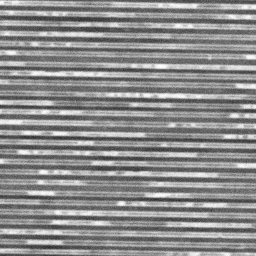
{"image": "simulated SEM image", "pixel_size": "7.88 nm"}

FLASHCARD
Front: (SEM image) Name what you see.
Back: parallel lines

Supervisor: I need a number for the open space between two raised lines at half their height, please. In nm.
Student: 52.2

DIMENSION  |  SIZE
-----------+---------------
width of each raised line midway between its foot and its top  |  29.5 nm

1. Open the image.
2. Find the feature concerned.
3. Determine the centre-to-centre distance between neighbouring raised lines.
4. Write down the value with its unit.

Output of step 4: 9.94 px